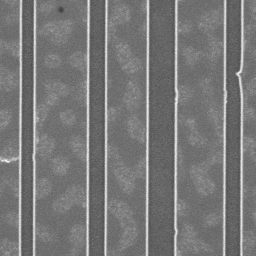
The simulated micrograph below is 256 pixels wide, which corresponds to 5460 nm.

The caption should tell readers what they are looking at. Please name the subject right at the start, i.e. one or a few lines or trenches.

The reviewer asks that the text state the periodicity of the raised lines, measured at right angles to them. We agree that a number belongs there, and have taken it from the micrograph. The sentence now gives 1480 nm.